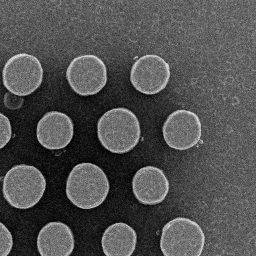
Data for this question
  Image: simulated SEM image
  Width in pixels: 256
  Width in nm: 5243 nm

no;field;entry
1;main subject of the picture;a regular array of raised bodies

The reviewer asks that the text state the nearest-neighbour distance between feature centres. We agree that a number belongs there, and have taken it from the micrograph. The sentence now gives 1.29 µm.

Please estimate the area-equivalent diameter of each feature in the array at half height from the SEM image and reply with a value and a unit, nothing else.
815 nm